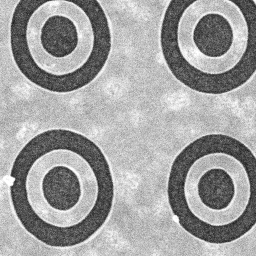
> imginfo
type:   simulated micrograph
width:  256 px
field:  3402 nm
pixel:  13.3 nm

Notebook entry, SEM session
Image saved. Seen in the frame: ring-shaped grooves with a dot in the middle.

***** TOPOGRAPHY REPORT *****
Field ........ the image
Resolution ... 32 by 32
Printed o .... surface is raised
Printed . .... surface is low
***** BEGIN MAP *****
oo....ooo...ooooooooo...ooooo...
oo..oooooo...oooooooo..ooooooo..
o...oo...oo..ooooooo...oo...ooo.
o..oo....oo...oooooo..oo.....oo.
o..oo.....oo..oooooo..oo.....oo.
o...o.....oo..oooooo..oo.....oo.
oo..oo...oo...oooooo...oo...oo..
oo..ooooooo..ooooooo...ooooooo..
oo...ooooo...oooooooo....oooo...
ooo.........oooooooooo..........
oooo.......oooooooooooo........o
ooooooooooooooooooooooooo....ooo
oooooooooooooooooooooooooooooooo
oooooooooooooooooooooooooooooooo
oooooooooooooooooooooooooooooooo
oooooooooooooooooooooooooooooooo
ooooo....ooooooooooooooooooooooo
oooo.......ooooooooooooo......oo
ooo.........ooooooooooo........o
oo...ooooo...ooooooooo....ooo...
oo..ooooooo...ooooooo...oooooo..
o...oo...ooo..ooooooo...oo..ooo.
oo.oo.....oo..ooooooo..oo....oo.
o..oo.....oo..ooooooo..oo....oo.
o..oo.....oo..ooooooo..oo....oo.
o...oo....oo..ooooooo...oo...oo.
oo..ooooooo...oooooooo..oooooo..
oo...ooooo...ooooooooo...oooo...
ooo..........oooooooooo........o
oooo........oooooooooooo......oo
oooooo....oooooooooooooooooooooo
oooooooooooooooooooooooooooooooo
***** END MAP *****